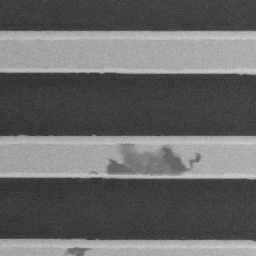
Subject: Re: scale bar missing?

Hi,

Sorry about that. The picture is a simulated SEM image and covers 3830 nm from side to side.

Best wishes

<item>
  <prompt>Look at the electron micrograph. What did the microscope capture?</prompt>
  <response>lines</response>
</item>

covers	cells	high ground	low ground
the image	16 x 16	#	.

................
................
################
################
.......#########
................
................
................
................
################
################
................
................
................
................
################